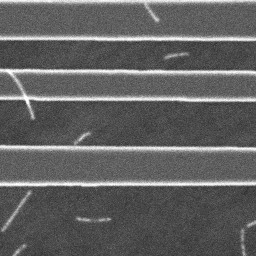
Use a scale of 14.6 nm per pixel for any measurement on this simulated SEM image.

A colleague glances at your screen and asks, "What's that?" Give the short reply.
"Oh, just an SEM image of lines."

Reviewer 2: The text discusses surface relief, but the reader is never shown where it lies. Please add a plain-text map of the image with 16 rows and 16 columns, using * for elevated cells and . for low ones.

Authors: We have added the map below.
****************
****************
................
................
****************
****************
................
................
................
****************
****************
***************.
................
................
................
................